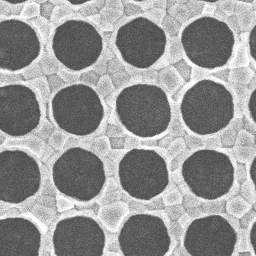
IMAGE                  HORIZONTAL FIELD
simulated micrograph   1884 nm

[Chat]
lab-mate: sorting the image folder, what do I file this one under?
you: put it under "a regular array of holes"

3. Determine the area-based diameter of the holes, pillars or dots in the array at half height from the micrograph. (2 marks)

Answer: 0.38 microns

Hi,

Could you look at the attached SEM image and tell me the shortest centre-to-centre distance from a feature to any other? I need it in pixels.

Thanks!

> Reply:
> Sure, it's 64.1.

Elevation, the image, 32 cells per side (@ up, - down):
@@@@@@@@@-@@@@@@@@@@@@@@@@@@@@@@
@@@@@@@@@@@@@@@@@@@@@@@@@@@@@@@@
@-@@@@@@@-@@@@@@@--@@@@@---@@@@@
----@@@-----@@@-----@@@------@@@
-----@@------@@------@@------@@-
-----@@------@-------@@------@@-
-----@@------@@------@@------@@-
----@@@-----@@@@----@@@@-----@@@
---@@@@@@--@@@@@@-@@@@@@@@-@@@@@
@@@@@@@@@@@@@@@@@@@@@@@@@@@@@@@@
@@@@@@@@@@@@@@@@@@@@@@@@----@@@@
----@@@-----@@@------@@------@@@
-----@@------@-------@@------@@-
-----@@------@-------@@------@@-
-----@@------@@------@@------@@-
-----@@-----@@@------@@------@@@
----@@@@----@@@@----@@@@---@@@@@
@@@@@@@@@@@@@@@@@@@@@@@@@@@@@@@@
@@@@@@@@@-@@@@@@@@@@@@@@@@@@@@@@
----@@@@----@@@@----@@@@----@@@@
-----@@------@@------@@------@@-
-----@-------@@------@@------@@-
-----@@------@@------@@------@@@
-----@@------@@------@@@-----@@@
----@@@@----@@@@----@@@@@---@@@@
@@@@@@@@@@@@@@@@@@@@@@@@@@@@@@@@
@@@@@@@@@@@@@@@@@@@@@@@@@@@@@@@@
---@@@@@----@@@@----@@@@----@@@@
-----@@------@@------@@------@@-
-----@@------@@------@@-------@-
-----@@------@@------@@------@@-
-----@@------@@------@@------@@@